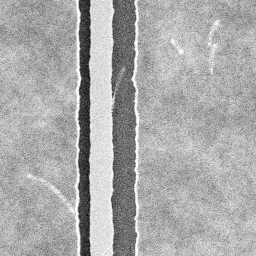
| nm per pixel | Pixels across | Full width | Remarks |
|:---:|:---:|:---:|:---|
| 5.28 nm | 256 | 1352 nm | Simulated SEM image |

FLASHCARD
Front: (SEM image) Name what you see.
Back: lines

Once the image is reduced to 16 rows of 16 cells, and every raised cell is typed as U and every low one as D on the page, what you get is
UUUUUDDDUUUUUUUU
UUUUUDDDUUUUUUUU
UUUUUDDDUUUUUUUU
UUUUUDDDUUUUUUUU
UUUUUDDDUUUUUUUU
UUUUUDDDUUUUUUUU
UUUUUDDDUUUUUUUU
UUUUUDDDDUUUUUUU
UUUUUDDDUUUUUUUU
UUUUUDDDUUUUUUUU
UUUUUDDDUUUUUUUU
UUUUUDDDUUUUUUUU
UUUUUDDDUUUUUUUU
UUUUUDDDUUUUUUUU
UUUUUDDDUUUUUUUU
UUUUUDDDUUUUUUUU